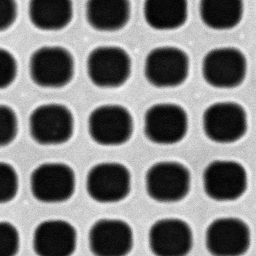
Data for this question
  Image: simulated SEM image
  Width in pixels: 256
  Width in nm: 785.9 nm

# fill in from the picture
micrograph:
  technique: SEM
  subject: a regular array of holes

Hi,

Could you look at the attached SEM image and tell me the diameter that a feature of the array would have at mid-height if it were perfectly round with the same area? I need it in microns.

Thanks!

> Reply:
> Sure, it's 0.128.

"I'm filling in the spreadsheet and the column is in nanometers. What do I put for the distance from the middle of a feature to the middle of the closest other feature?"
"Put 174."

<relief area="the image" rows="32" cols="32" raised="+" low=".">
..++.....++.....++.....++.....++
..++.....++.....++.....++.....++
..++.....++.....++.....++.....++
.++++...++++...++++..++++++.++++
++++++++++++++++++++++++++++++++
++++++++++++++++++++++++++++++++
.++++...++++....+++....+++....++
..++.....++.....++.....+++.....+
..++.....++.....++.....++......+
..++.....++.....++.....+++.....+
.++++...++++...++++...++++....++
++++++++++++++++++++++++++++++++
++++++++++++++++++++++++++++++++
.++++...++++...++++...++++....++
..++.....++.....++.....+++.....+
..++.....++.....++.....++......+
..++.....++.....++.....+++.....+
.++++...++++....+++...+++++..+++
++++++++++++++++++++++++++++++++
++++++++++++++++++++++++++++++++
.+++++.++++++..+++++..++++....++
..++.....++.....+++....+++.....+
..++.....++.....++......++.....+
..++.....++.....++.....+++.....+
..++.....++.....+++....+++....++
++++++++++++++++++++++++++++++++
++++++++++++++++++++++++++++++++
+++++++++++++.+++++++.+++++...++
..+++....+++....+++.....++.....+
..++.....++......++.....++.....+
..++.....++.....+++.....++.....+
..+++....+++....+++....+++....++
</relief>